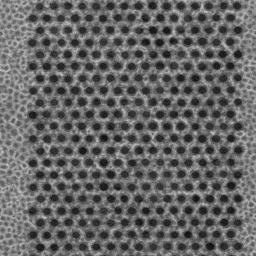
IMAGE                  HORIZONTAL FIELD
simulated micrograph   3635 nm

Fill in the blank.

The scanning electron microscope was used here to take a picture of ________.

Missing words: a regular array of raised bodies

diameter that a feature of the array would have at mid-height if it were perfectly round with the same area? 127 nanometres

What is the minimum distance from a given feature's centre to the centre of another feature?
185 nm